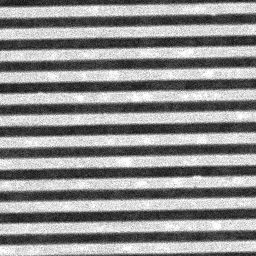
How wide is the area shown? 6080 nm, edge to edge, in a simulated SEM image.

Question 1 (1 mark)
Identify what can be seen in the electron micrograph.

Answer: parallel lines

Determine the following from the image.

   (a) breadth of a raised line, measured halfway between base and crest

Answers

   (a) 264 nanometers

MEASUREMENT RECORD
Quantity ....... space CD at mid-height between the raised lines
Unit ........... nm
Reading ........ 240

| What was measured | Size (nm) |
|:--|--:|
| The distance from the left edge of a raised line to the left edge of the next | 514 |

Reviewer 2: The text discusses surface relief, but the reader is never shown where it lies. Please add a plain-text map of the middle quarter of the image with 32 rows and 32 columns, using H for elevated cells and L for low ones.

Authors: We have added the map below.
LLLLLLLLLLLLLLLLLLLLLLLLLLLLLLLL
LLLLLLLLLLLHHHHHHHHHHHLLHHHHHHHH
HHHHHHHHHHHHHHHHHHHHHHHHHHHHHHHH
HHHHHHHHHHHHHHHHHHHHHHHHHHHHHHHH
LLLLLLLLLLLLLLLLLLLLLLLLLLLLLLLL
LLLLLLLLLLLLLLLLLLLLLLLLLLLLLLLL
LLLLLLLLLLLLLLLLLLLLLLLLLLLLLLLL
HHHHHHHHHHHHHHHHHHHHHHHHHHHHHHHH
HHHHHHHHHHHHHHHHHHHHHHHHHHHHHHHH
HHHHHHHHHHHHHHHHLLHLLLLLLLLLLLLL
LLLLLLLLLLLLLLLLLLLLLLLLLLLLLLLL
LLLLLLLLLLLLLLLLLLLLLLLLLLLLLLLL
LLLLLLLLLLLLLHHHHHHHHHHHHHHHHHHH
HHHHHHHHHHHHHHHHHHHHHHHHHHHHHHHH
HHHHHHHHHHHHHHHHHHHHHHHHHHHHHHHH
LLLLLLLLLLLLLLLLLLLLLLLLLLLLLLLL
LLLLLLLLLLLLLLLLLLLLLLLLLLLLLLLL
LLLLLLLLLLLLLLLLLLLLLLLLLLLLLLHH
HHHHHHHHHHHHHHHHHHHHHHHHHHHHHHHH
HHHHHHHHHHHHHHHHHHHHHHHHHHHHHHHH
HHHHLLLLLHHHHHHHHLLLLLLLLLLLLLLL
LLLLLLLLLLLLLLLLLLLLLLLLLLLLLLLL
LLLLLLLLLLLLLLLLLLLLLLLLLLLLLLLL
LLLLHHHHHHHHHHHHHHHHHHHHHHHHHHHH
HHHHHHHHHHHHHHHHHHHHHHHHHHHHHHHH
HHHHHHHHHHHHHHHHHHHHHHHHHHHHHHHH
LLLLLLLLLLLLLLLLLLLLLLLLLLLLLLLL
LLLLLLLLLLLLLLLLLLLLLLLLLLLLLLLL
LLLLLLLLLLLLLLLLLLLLHHHHHHHHHHHH
HHHHHHHHHHHHHHHHHHHHHHHHHHHHHHHH
HHHHHHHHHHHHHHHHHHHHHHHHHHHHHHHH
LLLLLLLLLLLLLLLLLLLLLLLLLLLLLLLL